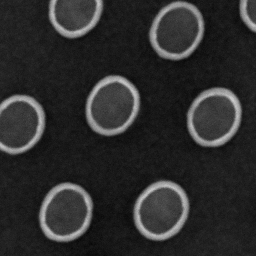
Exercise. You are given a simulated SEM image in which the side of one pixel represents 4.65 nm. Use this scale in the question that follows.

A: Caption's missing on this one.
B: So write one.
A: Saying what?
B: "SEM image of raised bodies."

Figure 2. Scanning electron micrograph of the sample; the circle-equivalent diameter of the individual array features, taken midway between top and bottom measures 239 nm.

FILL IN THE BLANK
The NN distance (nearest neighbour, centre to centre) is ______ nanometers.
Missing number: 443